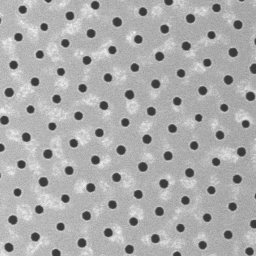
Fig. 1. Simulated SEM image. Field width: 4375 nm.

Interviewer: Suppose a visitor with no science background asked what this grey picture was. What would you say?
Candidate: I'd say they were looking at a regular array of holes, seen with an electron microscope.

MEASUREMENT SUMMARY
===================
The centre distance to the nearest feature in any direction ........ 465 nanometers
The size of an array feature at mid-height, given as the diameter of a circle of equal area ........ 0.155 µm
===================